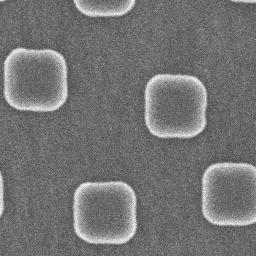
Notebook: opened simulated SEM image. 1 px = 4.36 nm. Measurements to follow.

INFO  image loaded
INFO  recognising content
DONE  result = raised bodies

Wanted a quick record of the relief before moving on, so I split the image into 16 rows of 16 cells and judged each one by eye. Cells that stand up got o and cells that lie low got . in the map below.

.....ooo........
................
................
.ooo............
oooo............
oooo.....oooo...
.ooo.....oooo...
.........oooo...
..........o.....
................
.............ooo
......oo.....ooo
.....ooo.....ooo
.....ooo.....ooo
.....ooo........
................